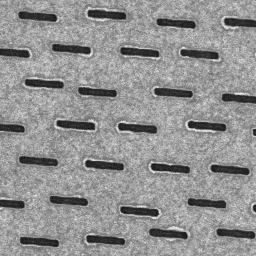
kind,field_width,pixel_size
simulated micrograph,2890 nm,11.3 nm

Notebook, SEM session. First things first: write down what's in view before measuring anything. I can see a regular array of holes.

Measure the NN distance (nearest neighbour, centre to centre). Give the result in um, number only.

0.505